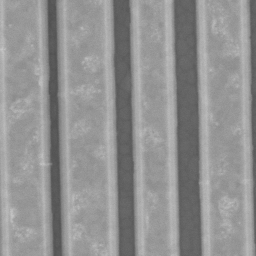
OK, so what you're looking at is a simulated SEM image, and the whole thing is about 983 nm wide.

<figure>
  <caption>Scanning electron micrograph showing one or a few lines or trenches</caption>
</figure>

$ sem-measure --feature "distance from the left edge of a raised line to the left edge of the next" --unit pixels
67.7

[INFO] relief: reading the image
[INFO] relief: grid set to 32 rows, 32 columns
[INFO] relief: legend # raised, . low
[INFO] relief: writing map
#####...#####....####....#####..
#####...#####....####....######.
#####...#####....####....######.
#####...######...####....######.
#####...######...####....######.
#####...######...####....######.
#####...######...####....######.
#####...#####....####....######.
#####...######...####....######.
#####...######...####....######.
#####...######...####....######.
#####...######...####.....#####.
#####...######...####.....#####.
######..######...####.....#####.
######..######...####.....#####.
######..######...####.....#####.
######..######...####.....#####.
#####...######...####.....#####.
#####...######...####.....#####.
######..######...####.....#####.
.#####..######...####.....#####.
.#####..######....###.....#####.
.#####..######....###.....#####.
.#####..######....####....#####.
.#####..######....####....#####.
.#####..######....####....#####.
.#####..######....####....#####.
.#####..######....####....#####.
.#####..######....####....#####.
.#####...#####....####....#####.
.#####...#####....####....#####.
.#####...#####....####....#####.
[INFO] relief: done